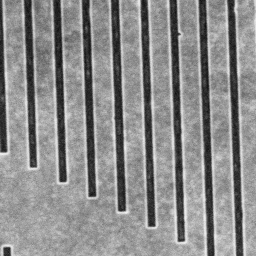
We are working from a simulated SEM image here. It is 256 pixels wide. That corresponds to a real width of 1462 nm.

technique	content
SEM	parallel lines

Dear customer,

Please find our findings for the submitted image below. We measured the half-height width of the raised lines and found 0.118 µm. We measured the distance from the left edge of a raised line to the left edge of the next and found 166 nm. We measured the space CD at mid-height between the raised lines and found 0.0485 micrometres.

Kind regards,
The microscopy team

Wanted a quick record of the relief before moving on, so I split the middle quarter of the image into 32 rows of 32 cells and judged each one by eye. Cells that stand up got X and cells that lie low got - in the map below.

XXXXX--XXXXX---XXXX---XXXXX--XXX
XXXXX--XXXXX---XXXX---XXXXX--XXX
XXXXX--XXXXX---XXXX---XXXXX--XXX
XXXXX--XXXXX---XXXX---XXXXX--XXX
XXXXX--XXXXX---XXXX---XXXXX--XXX
XXXXX--XXXXX---XXXXX--XXXXX--XXX
XXXXX--XXXXX---XXXXX--XXXXX--XXX
XXXXX--XXXXX---XXXXX--XXXXX--XXX
XXXXX--XXXXX---XXXXX--XXXXX--XXX
XXXXX--XXXXX---XXXXX--XXXXX--XXX
XXXXX---XXXX---XXXXX--XXXXX--XXX
XXXXX--XXXXX---XXXXX--XXXXX--XXX
XXXXX--XXXXX---XXXXX--XXXXX--XXX
XXXXX--XXXXX---XXXXX--XXXXX--XXX
XXXXX---XXXX---XXXXX--XXXXX---XX
XXXXX---XXXXX--XXXXX--XXXXX---XX
-XXXX---XXXXX--XXXXX--XXXXX---XX
-XXXX---XXXXX--XXXXX--XXXXX---XX
-XXXX---XXXXX--XXXXX--XXXXX---XX
-XXXX---XXXXX--XXXXX--XXXXX---XX
-XXXX---XXXXX--XXXXX--XXXXX---XX
-XXXX---XXXXX--XXXXX--XXXXX---XX
-XXXX---XXXXX--XXXXX--XXXXX---XX
-XXXX---XXXXX--XXXXX--XXXXX---XX
-XXXXX--XXXXX--XXXXX---XXXX---XX
-XXXXX--XXXXX--XXXXX---XXXXX--XX
-XXXXX--XXXXX--XXXXX---XXXXX--XX
-XXXXX--XXXXX---XXXX---XXXXX--XX
-XXXXX--XXXXX---XXXX---XXXXX--XX
-XXXXX--XXXXX---XXXX---XXXXX--XX
XXXXXX--XXXXX---XXXX---XXXXX--XX
XXXXXX--XXXXX---XXXX---XXXXX--XX